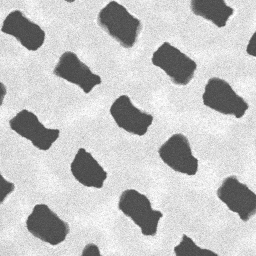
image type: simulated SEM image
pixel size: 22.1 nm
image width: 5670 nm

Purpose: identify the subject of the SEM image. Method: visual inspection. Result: a regular array of holes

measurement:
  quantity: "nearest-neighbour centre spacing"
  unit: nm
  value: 1480